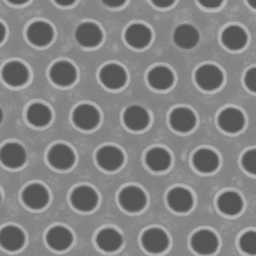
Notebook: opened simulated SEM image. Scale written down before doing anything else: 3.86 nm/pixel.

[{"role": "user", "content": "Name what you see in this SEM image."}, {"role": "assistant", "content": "a regular array of holes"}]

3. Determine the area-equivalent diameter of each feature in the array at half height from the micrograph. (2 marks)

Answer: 0.0901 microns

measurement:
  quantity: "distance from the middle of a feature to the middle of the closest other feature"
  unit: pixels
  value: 46.6